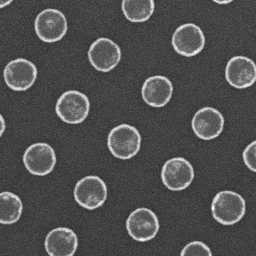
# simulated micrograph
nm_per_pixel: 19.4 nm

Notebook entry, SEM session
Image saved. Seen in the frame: a regular array of raised bodies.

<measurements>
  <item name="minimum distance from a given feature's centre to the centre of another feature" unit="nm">1170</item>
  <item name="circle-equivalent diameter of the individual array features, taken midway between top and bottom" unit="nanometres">604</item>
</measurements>